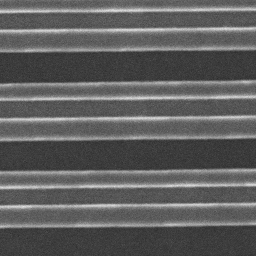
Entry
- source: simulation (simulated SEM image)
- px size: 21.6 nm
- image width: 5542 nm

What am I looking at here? lines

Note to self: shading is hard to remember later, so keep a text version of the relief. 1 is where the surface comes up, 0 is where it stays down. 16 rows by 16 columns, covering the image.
1111111111111111
1111111111111111
1111111111111111
0000000000000000
0000000000000000
1111111111111111
1111111111111111
1111111111111111
1111111111111111
0000000000000000
0000000000000000
1111111111111111
1111111111111111
1111111111111111
0000000000000000
0000000000000000